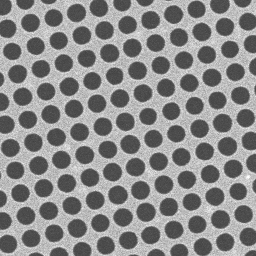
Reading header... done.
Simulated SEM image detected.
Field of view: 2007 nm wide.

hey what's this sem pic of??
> a regular array of holes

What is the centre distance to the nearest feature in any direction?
182 nanometres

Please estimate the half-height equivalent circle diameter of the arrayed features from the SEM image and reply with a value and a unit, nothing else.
145 nm